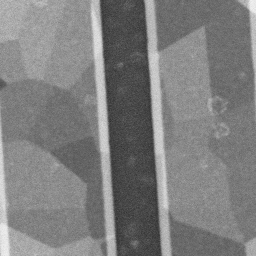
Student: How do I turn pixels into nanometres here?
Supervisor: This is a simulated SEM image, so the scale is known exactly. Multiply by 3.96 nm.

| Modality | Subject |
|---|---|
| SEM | one or a few lines or trenches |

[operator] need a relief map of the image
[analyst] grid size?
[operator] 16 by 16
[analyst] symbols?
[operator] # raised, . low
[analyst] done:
######...#######
######...#######
######....######
######....######
######....######
######....######
######....######
######....######
######....######
#######...######
#######...######
#######...######
#######...######
#######...######
#######...######
#######...######